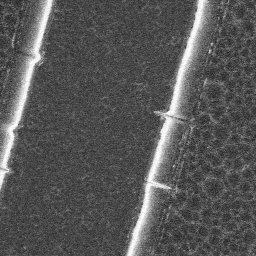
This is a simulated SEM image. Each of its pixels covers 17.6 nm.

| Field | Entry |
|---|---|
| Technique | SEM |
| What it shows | one or a few lines or trenches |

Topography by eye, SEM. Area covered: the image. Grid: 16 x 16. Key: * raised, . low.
...**********...
...*********....
..**********....
..**********....
..*********.....
..*********.....
.**********.....
.**********.....
.*********......
**********......
**********......
*********.......
*********.......
*********.......
*********.......
********........